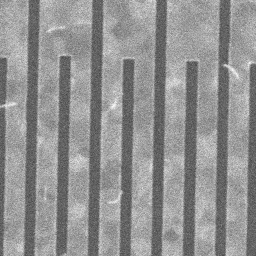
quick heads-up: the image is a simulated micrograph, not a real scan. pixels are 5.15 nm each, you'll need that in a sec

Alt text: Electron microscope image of parallel lines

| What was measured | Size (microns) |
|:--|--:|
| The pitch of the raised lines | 0.164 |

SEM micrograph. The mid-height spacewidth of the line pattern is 59.2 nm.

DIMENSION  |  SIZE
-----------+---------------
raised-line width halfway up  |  103 nm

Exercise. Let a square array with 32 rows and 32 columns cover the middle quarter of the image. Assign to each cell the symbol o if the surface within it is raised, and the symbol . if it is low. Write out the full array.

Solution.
..ooooo...oooo....ooooo...oooo..
..ooooo...oooo....oooo....oooo..
..ooooo...oooo....oooo....oooo..
..ooooo...oooo....oooo....oooo..
..ooooo...oooo....oooo....oooo..
..oooo....oooo....oooo....ooo...
..oooo....oooo....oooo...ooooo..
..oooo....oooo....oooo...ooooo..
..oooo....oooo....oooo...ooooo..
..oooo....oooo....oooo...ooooo..
..oooo....oooo....oooo...ooooo..
..oooo....oooo....oooo...ooooo..
..oooo....oooo....oooo...ooooo..
..oooo....oooo....oooo...ooooo..
..oooo...ooooo...ooooo...ooooo..
..oooo...ooooo...ooooo...ooooo..
..oooo...ooooo...ooooo...ooooo..
..oooo...ooooo...ooooo...ooooo..
..oooo...ooooo...ooooo...ooooo..
.ooooo...ooooo...ooooo...ooooo..
.ooooo...ooooo...ooooo...ooooo..
.ooooo...ooooo...ooooo...ooooo..
.ooooo...ooooo...ooooo...ooooo..
.ooooo...ooooo...ooooo...ooooo..
.ooooo...ooooo...ooooo...ooooo..
.ooooo...ooooo...ooo.....ooooo..
.ooooo...ooooo...ooooo...ooooo..
.ooooo...ooooo...ooooo...ooooo..
.ooooo...ooooo...ooooo...ooooo..
.ooooo...ooooo...ooooo...ooooo..
.ooooo...ooooo...ooooo...ooooo..
.ooooo...ooooo...ooooo...ooooo..